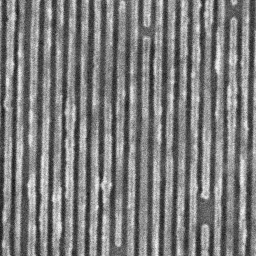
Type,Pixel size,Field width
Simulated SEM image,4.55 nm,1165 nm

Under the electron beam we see parallel lines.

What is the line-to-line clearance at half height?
27.3 nm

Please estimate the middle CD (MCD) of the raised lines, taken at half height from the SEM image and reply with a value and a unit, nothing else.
30.7 nm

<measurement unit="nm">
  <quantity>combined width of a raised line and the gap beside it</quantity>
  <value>56.4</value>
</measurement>